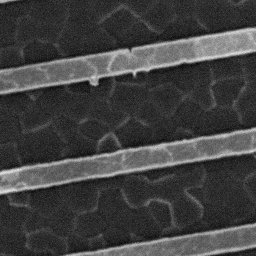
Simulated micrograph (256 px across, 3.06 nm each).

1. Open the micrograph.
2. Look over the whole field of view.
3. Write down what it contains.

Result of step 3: one or a few lines or trenches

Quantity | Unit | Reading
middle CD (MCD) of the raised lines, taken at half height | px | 21.1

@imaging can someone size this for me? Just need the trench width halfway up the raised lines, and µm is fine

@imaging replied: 0.236